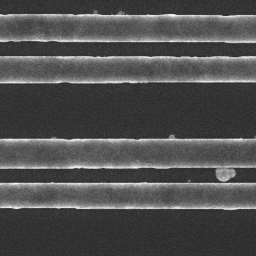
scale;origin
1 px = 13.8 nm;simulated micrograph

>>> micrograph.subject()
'lines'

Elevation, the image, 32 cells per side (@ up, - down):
--------------------------------
--------------------------------
@@@@@@@@@@@@@@@@@@@@@@@@@@@@@@@@
@@@@@@@@@@@@@@@@@@@@@@@@@@@@@@@@
@@@@@@@@@@@@@@@@@@@@@@@@@@@@@@@@
--------------------------------
--------------------------------
@@@@@@@@@@@@@@@@@@@@@@@@@@@@@@@@
@@@@@@@@@@@@@@@@@@@@@@@@@@@@@@@@
@@@@@@@@@@@@@@@@@@@@@@@@@@@@@@@@
--------------------------------
--------------------------------
--------------------------------
--------------------------------
--------------------------------
--------------------------------
--------------------------------
@@@@@@@@@@@@@@@@@@@@@@@@@@@@@@@@
@@@@@@@@@@@@@@@@@@@@@@@@@@@@@@@@
@@@@@@@@@@@@@@@@@@@@@@@@@@@@@@@@
@@@@@@@@@@@@@@@@@@@@@@@@@@@@@@@@
---------------------------@@---
---------------------------@----
@@@@@@@@@@@@@@@@@@@@@@@@@@@@@@@@
@@@@@@@@@@@@@@@@@@@@@@@@@@@@@@@@
@@@@@@@@@@@@@@@@@@@@@@@@@@@@@@@@
--------------------------------
--------------------------------
--------------------------------
--------------------------------
--------------------------------
--------------------------------